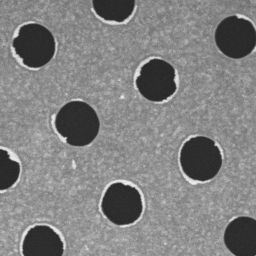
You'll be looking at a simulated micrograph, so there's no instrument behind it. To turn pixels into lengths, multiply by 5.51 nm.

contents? holes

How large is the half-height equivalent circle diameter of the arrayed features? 0.232 micrometres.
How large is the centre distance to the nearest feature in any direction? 494 nm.